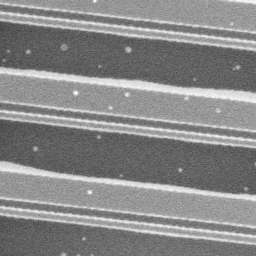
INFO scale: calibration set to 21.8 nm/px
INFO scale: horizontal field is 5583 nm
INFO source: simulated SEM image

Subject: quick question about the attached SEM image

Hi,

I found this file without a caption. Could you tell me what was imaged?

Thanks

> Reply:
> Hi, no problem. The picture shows lines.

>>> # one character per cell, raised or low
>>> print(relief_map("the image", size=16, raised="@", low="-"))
@@@@@@@@@@@@@@@@
--@@@@@@@@@@@@@@
-----------@@@@@
----------------
@---------------
@@@@@@@@@@------
@@@@@@@@@@@@@@@@
-@@@@@@@@@@@@@@@
----------@@@@@@
----------------
@---------------
@@@@@@@@--------
@@@@@@@@@@@@@@@@
-@@@@@@@@@@@@@@@
---------@@@@@@@
----------------